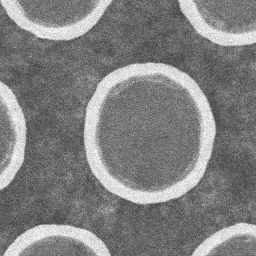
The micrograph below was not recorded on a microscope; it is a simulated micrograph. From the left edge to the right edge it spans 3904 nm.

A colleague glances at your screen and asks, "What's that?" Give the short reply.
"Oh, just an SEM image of raised bodies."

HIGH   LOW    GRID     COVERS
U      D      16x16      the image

DUUUUUDDDDDDUUUU
DDUUUDDDDDDDUUUU
DDDDDDDDDDDDDDDD
DDDDDDDDDDDDDDDD
DDDDDDDDUUUDDDDD
DDDDDDUUUUUUDDDD
UDDDDDUUUUUUUDDD
UDDDDDUUUUUUUDDD
UDDDDDUUUUUUUDDD
UDDDDDUUUUUUUDDD
UDDDDDUUUUUUUDDD
DDDDDDDUUUUUDDDD
DDDDDDDDDDDDDDDD
DDDDDDDDDDDDDDDD
DDDUDDDDDDDDDDUU
DUUUUUDDDDDDDUUU